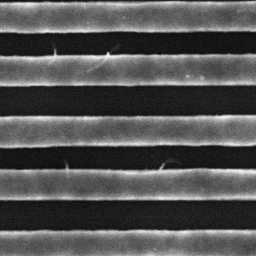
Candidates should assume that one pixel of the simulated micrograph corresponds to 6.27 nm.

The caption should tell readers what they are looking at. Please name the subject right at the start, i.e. lines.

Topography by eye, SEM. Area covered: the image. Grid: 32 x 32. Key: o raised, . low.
oooooooooooooooooooooooooooooooo
oooooooooooooooooooooooooooooooo
oooooooooooooooooooooooooooooooo
oooooooooooooooooooooooooooooooo
................................
................................
................................
oooooooooooooooooooooooooooooooo
oooooooooooooooooooooooooooooooo
oooooooooooooooooooooooooooooooo
oooooooooooooooooooooooooooooooo
................................
................................
................................
.............................o.o
oooooooooooooooooooooooooooooooo
oooooooooooooooooooooooooooooooo
oooooooooooooooooooooooooooooooo
................................
................................
................................
oooooooooooooooooooooooooooooooo
oooooooooooooooooooooooooooooooo
oooooooooooooooooooooooooooooooo
oooooooooooooooooooooooooooooooo
................................
................................
................................
................................
oooooooooooooooooooooooooooooooo
oooooooooooooooooooooooooooooooo
oooooooooooooooooooooooooooooooo